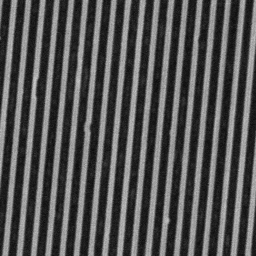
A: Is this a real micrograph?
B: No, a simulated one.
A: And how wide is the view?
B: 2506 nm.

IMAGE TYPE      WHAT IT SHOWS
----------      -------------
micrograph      parallel lines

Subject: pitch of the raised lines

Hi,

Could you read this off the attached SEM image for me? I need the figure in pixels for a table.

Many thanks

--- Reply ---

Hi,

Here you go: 14.2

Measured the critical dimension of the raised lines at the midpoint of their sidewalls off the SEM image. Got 47.5 nanometers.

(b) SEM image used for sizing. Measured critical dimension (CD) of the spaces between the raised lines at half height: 95.1 nm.